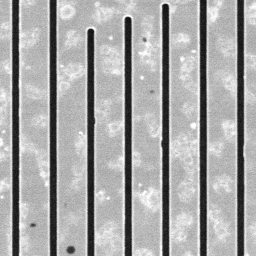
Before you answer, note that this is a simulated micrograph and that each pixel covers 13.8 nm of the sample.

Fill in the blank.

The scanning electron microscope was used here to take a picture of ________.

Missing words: parallel lines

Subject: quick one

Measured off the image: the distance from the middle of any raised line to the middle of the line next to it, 0.519 micrometres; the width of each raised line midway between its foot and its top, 414 nanometers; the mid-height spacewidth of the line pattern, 104 nm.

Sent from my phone